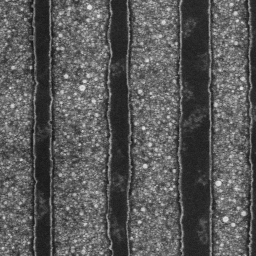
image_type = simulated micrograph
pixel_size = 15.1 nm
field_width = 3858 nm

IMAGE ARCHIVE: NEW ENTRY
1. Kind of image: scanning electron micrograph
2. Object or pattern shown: one or a few lines or trenches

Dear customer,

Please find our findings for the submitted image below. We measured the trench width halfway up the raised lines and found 777 nanometres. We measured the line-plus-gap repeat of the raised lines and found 1150 nanometers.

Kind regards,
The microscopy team